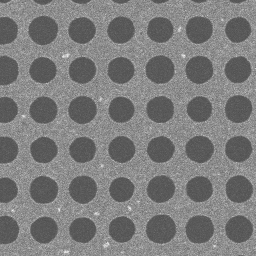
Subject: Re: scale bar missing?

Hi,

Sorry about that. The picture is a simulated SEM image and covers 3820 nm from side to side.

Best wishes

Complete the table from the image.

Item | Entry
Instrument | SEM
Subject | a regular array of holes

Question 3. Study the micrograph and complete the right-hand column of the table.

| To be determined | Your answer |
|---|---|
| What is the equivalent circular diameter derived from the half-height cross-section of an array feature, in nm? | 408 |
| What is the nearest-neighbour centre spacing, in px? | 38.9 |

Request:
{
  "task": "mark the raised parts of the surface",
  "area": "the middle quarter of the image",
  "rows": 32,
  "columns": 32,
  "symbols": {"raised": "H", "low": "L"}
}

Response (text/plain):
HLLLLLLLHHHLLLLLLHHHLLLLLLLLHHLL
HLLLLLLLHHHLLLLLLLHHLLLLLLLLHHLL
HLLLLLLLHHHLLLLLLLHHLLLLLLLLHHLL
HHLLLLLHHHHLLLLLLHHHHLLLLLLHHHHL
HHHLLLHHHHHHLLLLHHHHHHLLLLHHHHHH
HHHHHHHHHHHHHHHHHHHHHHHHHHHHHHHH
HHHHHHHHHHHHHHHHHHHHHHHHHHHHHHHH
HHHHHHHHHHHHHHHHHHHHHHHHHHHHHHHH
HHHLLLLHHHHHHLLLHHHHHHLLLLHHHHHH
HHLLLLLLHHHHLLLLLHHHHLLLLLLHHHHL
HLLLLLLLHHHLLLLLLHHHHLLLLLLLHHHL
HLLLLLLLHHHLLLLLLLHHLLLLLLLLHHHL
HLLLLLLLHHHLLLLLLLHHHLLLLLLHHHHL
HHLLLLLLHHHHLLLLLHHHHLLLLLLHHHHL
HHHLLLHHHHHHHLLHHHHHHHHLLLHHHHHH
HHHHHHHHHHHHHHHHHHHHHHHHHHHHHHHH
HHHHHHHHHHHHHHHHHHHHHHHHHHHHHHHH
HHHHHHHHHHHHHHHHHHHHHHHHHHHHHHHH
HHHLLLHHHHHHHLLLHHHHHHLLLLHHHHHH
HHLLLLLLHHHHLLLLLHHHHLLLLLLHHHHL
HLLLLLLLHHHLLLLLLLHHHLLLLLLLHHLL
HLLLLLLLHHHLLLLLLLHHHLLLLLLLHHLL
HLLLLLLLHHHLLLLLLLHHHLLLLLLHHHLL
HHLLLLLHHHHHLLLLLHHHHLLLLLLHHHHL
HHHLLLHHHHHHHLLLHHHHHHHLLHHHHHHH
HHHHHHHHHHHHHHHHHHHHHHHHHHHHHHHH
HHHHHHHHHHHHHHHHHHHHHHHHHHHHHHHH
HHHHHHHHHHHHHHHHHHHHHHHHHHHHHHHH
HHHLLLLHHHHHHLLLHHHHHHLLLLHHHHHH
HHLLLLLLHHHHLLLLLHHHHLLLLLLHHHHL
HLLLLLLLHHHLLLLLLLHHHLLLLLLLHHHL
HLLLLLLLHHHLLLLLLLHHHLLLLLLLHHLL